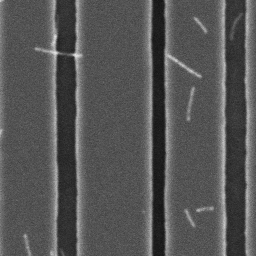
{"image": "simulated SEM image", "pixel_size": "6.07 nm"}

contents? lines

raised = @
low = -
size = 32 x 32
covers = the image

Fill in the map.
@@@@@@@---@@@@@@@@@--@@@@@@@---@
@@@@@@@---@@@@@@@@@--@@@@@@@---@
@@@@@@@---@@@@@@@@@--@@@@@@@---@
@@@@@@@---@@@@@@@@@--@@@@@@@---@
@@@@@@@---@@@@@@@@@--@@@@@@@---@
@@@@@@@---@@@@@@@@@--@@@@@@@---@
@@@@@@@--@@@@@@@@@@--@@@@@@@---@
@@@@@@@--@@@@@@@@@@--@@@@@@@---@
@@@@@@@---@@@@@@@@@--@@@@@@@---@
@@@@@@@---@@@@@@@@@--@@@@@@@---@
@@@@@@@---@@@@@@@@@--@@@@@@@---@
@@@@@@@---@@@@@@@@@--@@@@@@@---@
@@@@@@@---@@@@@@@@@--@@@@@@@---@
@@@@@@@---@@@@@@@@@--@@@@@@@---@
@@@@@@@---@@@@@@@@@--@@@@@@@---@
@@@@@@@---@@@@@@@@@--@@@@@@@---@
@@@@@@@---@@@@@@@@@--@@@@@@@---@
@@@@@@@---@@@@@@@@@--@@@@@@@---@
@@@@@@@---@@@@@@@@@--@@@@@@@---@
@@@@@@@---@@@@@@@@@--@@@@@@@---@
@@@@@@@---@@@@@@@@@--@@@@@@@---@
@@@@@@@---@@@@@@@@@--@@@@@@@---@
@@@@@@@---@@@@@@@@@--@@@@@@@---@
@@@@@@@---@@@@@@@@@--@@@@@@@---@
@@@@@@@---@@@@@@@@@--@@@@@@@---@
@@@@@@@---@@@@@@@@@--@@@@@@@---@
@@@@@@@---@@@@@@@@@--@@@@@@@---@
@@@@@@@---@@@@@@@@@--@@@@@@@---@
@@@@@@@---@@@@@@@@@--@@@@@@@---@
@@@@@@@---@@@@@@@@@--@@@@@@@---@
@@@@@@@---@@@@@@@@@--@@@@@@@---@
@@@@@@@---@@@@@@@@@--@@@@@@@---@